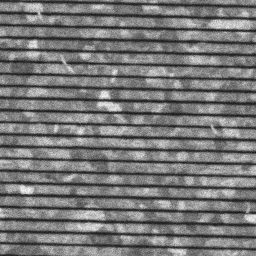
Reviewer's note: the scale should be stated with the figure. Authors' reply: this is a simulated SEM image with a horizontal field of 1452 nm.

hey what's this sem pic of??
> parallel lines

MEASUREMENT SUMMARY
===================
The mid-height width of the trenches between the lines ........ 17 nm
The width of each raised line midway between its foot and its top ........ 51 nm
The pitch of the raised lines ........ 68.8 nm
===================